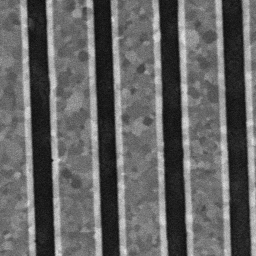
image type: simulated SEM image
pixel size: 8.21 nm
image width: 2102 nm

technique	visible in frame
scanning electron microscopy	one or a few lines or trenches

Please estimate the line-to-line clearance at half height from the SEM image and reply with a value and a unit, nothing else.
212 nanometres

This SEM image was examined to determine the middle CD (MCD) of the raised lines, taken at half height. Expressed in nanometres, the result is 325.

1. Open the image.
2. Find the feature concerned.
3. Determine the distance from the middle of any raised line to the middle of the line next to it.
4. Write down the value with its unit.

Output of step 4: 535 nanometres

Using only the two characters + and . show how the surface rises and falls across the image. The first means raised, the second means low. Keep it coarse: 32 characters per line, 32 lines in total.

+++...+++++...+++++....++++....+
+++...+++++...+++++....++++....+
+++...+++++...+++++....++++....+
+++...+++++...++++++...++++....+
+++...+++++...++++++...++++....+
+++...+++++...++++++...++++....+
+++...+++++....+++++...++++....+
+++...+++++....+++++...+++++...+
+++....++++....+++++...+++++...+
+++....++++....+++++...+++++...+
+++....++++....+++++...+++++...+
+++....++++....+++++...+++++...+
+++....+++++...+++++...+++++...+
+++....+++++...+++++...+++++...+
+++....+++++...+++++...+++++...+
+++....+++++...+++++...+++++...+
+++....+++++...+++++...+++++...+
++++...+++++...+++++...+++++...+
++++...+++++...+++++...+++++...+
++++...+++++...+++++...+++++....
++++...+++++...+++++...+++++...+
++++...+++++...+++++...+++++...+
++++...+++++...+++++....++++....
++++...+++++...+++++....++++....
++++...+++++...+++++....++++....
++++...+++++...+++++....++++....
++++...+++++...+++++....++++....
++++...+++++...+++++....++++....
++++...+++++...+++++....++++....
++++...+++++...+++++....++++....
++++...+++++...+++++....++++....
++++...+++++...+++++....++++....